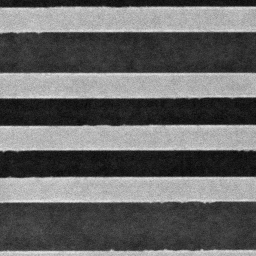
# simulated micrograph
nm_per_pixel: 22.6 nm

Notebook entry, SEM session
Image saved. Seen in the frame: lines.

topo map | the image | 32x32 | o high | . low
................................
oooooooooooooooooooooooooooooooo
oooooooooooooooooooooooooooooooo
oooooooooooooooooooooooooooooooo
................................
................................
................................
................................
................................
oooooooooooooooooooooooooooooooo
oooooooooooooooooooooooooooooooo
oooooooooooooooooooooooooooooooo
................................
................................
................................
................................
oooooooooooooooooooooooooooooooo
oooooooooooooooooooooooooooooooo
oooooooooooooooooooooooooooooooo
................................
................................
................................
oooooooooooooooooooooooooooooooo
oooooooooooooooooooooooooooooooo
oooooooooooooooooooooooooooooooo
................................
................................
................................
................................
................................
................................
oooooooooooooooooooooooooooooooo